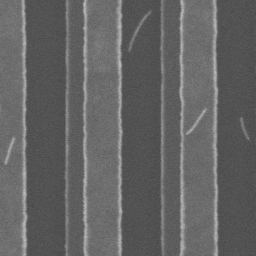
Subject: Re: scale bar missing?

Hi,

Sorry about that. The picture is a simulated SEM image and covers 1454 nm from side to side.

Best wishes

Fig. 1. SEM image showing lines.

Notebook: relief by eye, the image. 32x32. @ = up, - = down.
@@@-----@@@@@@@-----@@@@@@@-----
@@@-----@@@@@@@-----@@@@@@@-----
@@@-----@@@@@@@-----@@@@@@@-----
@@@-----@@@@@@@-----@@@@@@@-----
@@@-----@@@@@@@-----@@@@@@@-----
@@@-----@@@@@@@-----@@@@@@@-----
@@@-----@@@@@@@-----@@@@@@@-----
@@@-----@@@@@@@-----@@@@@@@-----
@@@-----@@@@@@@-----@@@@@@@-----
@@@-----@@@@@@@-----@@@@@@@-----
@@@-----@@@@@@@-----@@@@@@@-----
@@@-----@@@@@@@-----@@@@@@@-----
@@@-----@@@@@@@-----@@@@@@@-----
@@@-----@@@@@@@-----@@@@@@@-----
@@@-----@@@@@@@-----@@@@@@@-----
@@@-----@@@@@@@-----@@@@@@@-----
@@@-----@@@@@@@-----@@@@@@@-----
@@@-----@@@@@@@-----@@@@@@@-----
@@@-----@@@@@@@-----@@@@@@@-----
@@@-----@@@@@@@-----@@@@@@@-----
@@@-----@@@@@@@-----@@@@@@@-----
@@@-----@@@@@@@-----@@@@@@@-----
@@@-----@@@@@@@-----@@@@@@@-----
@@@-----@@@@@@@-----@@@@@@@-----
@@@-----@@@@@@@-----@@@@@@@-----
@@@-----@@@@@@@-----@@@@@@@-----
@@@-----@@@@@@@-----@@@@@@@-----
@@@-----@@@@@@@-----@@@@@@@-----
@@@-----@@@@@@@-----@@@@@@@-----
@@@-----@@@@@@@-----@@@@@@@-----
@@@-----@@@@@@@-----@@@@@@@-----
@@@-----@@@@@@@-----@@@@@@@-----